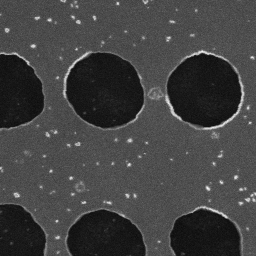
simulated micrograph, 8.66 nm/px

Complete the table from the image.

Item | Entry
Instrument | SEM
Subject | holes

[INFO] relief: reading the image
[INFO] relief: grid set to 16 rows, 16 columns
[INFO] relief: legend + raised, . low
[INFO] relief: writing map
++++++++++++++++
++++++++++++++++
++++++++++++++++
.++++..+++++.+++
..++.....++....+
...+.....+.....+
...+.....++....+
..+++...+++...++
++++++++++++++++
++++++++++++++++
++++++++++++++++
++++++++++++++++
++++++++++++++++
..+++...+++...++
...+.....++....+
...+.....++....+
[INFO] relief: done